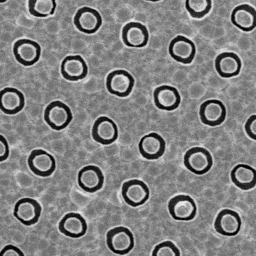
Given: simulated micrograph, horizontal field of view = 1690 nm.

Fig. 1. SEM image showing a regular array of ring-shaped grooves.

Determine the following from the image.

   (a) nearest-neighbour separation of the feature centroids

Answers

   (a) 0.318 micrometres